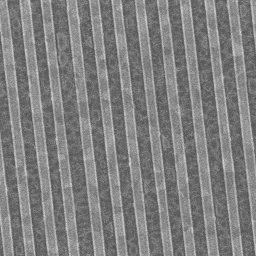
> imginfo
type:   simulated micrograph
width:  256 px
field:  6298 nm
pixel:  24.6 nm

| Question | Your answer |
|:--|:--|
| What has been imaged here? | parallel lines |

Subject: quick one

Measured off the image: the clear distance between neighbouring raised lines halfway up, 13.7 px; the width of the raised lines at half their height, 211 nm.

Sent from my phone